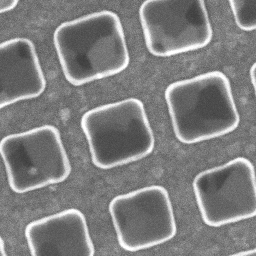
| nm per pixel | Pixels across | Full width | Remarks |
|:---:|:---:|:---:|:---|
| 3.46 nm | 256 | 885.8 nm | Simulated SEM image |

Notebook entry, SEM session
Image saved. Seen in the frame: raised bodies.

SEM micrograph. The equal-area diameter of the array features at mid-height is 233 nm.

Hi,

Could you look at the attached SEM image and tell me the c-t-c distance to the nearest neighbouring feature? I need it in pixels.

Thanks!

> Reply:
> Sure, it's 88.2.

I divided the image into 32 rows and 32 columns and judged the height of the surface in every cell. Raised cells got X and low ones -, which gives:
XX----------------XXXXXXX----XXX
------------------XXXXXXXX---XXX
----------XXXXX---XXXXXXXX---XXX
-------XXXXXXXX---XXXXXXXX----XX
-------XXXXXXXX---XXXXXXXX------
XXXX---XXXXXXXXX---XXXXXX-------
XXXX---XXXXXXXXX---XXX----------
XXXXX---XXXXXXXX----------------
XXXXX---XXXXXXX-----------------
XXXXX---XXXXX------------XXX----
XXXXX-----------------XXXXXX----
XXXXX----------------XXXXXXXX---
XX--------------X----XXXXXXXX---
-------------XXXXX---XXXXXXXX---
-----------XXXXXXX---XXXXXXXXX--
----------XXXXXXXX----XXXXXXXX--
---XXXX----XXXXXXXX---XXXXXX----
XXXXXXX----XXXXXXXX----XX-------
XXXXXXXX---XXXXXXXX-------------
XXXXXXXX----XXXXXX--------------
-XXXXXXX----XXX--------------XX-
-XXXXXXXX-----------------XXXXXX
-XXXXXXX----------------XXXXXXXX
--XX---------------X----XXXXXXXX
---------------XXXXXX----XXXXXXX
--------------XXXXXXX----XXXXXXX
--------XX----XXXXXXX----XXXXXXX
------XXXX----XXXXXXXX----XXX---
----XXXXXXX---XXXXXXXX----------
----XXXXXXX----XXXXXX-----------
----XXXXXXX----XXXX-------------
----XXXXXXXX-------------------X